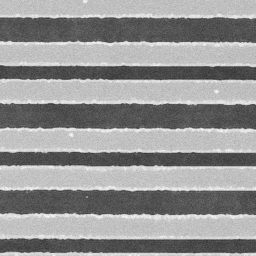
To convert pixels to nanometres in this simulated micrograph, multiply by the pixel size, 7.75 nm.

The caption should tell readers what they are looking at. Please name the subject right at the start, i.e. lines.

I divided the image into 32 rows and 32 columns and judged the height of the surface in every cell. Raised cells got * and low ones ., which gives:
********************************
********************************
................................
................................
................................
********************************
********************************
********************************
................................
................................
********************************
********************************
********************************
................................
................................
................................
********************************
********************************
********************************
................................
................................
********************************
********************************
********************************
................................
................................
................................
********************************
********************************
********************************
................................
................................